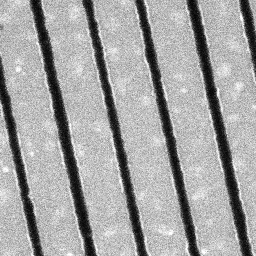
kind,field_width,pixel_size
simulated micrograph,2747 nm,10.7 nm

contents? parallel lines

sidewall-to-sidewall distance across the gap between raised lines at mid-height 406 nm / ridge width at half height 140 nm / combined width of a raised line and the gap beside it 547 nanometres